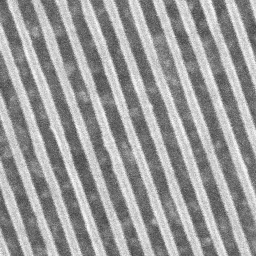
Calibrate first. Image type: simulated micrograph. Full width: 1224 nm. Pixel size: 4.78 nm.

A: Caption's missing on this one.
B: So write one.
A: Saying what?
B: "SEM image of parallel lines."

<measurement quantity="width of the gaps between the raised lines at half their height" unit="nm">69.9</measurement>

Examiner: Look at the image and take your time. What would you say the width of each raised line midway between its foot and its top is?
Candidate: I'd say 38.9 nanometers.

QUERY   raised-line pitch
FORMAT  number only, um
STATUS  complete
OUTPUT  0.109